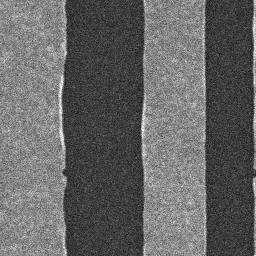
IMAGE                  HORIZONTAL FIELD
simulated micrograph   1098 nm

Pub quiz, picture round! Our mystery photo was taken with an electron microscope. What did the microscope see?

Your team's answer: one or a few lines or trenches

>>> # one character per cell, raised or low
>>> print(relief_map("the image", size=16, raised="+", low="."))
++++.....++++...
++++.....++++...
++++.....++++...
++++.....++++...
++++.....++++...
++++.....++++...
++++.....++++...
++++.....++++...
++++.....++++...
++++.....++++...
++++.....++++...
++++.....++++...
++++.....++++...
++++.....++++...
++++.....++++...
++++.....++++...